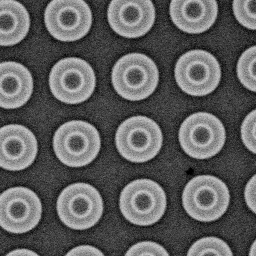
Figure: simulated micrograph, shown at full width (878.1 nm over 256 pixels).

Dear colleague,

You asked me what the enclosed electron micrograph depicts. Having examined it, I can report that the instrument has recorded an array of small figures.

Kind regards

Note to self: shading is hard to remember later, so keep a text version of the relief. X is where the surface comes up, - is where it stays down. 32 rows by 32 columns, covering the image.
XXX---XXXXX---XXXXX--XXXXXX--XXX
XXX---XXXXX--XXXXXX--XXXXXX--XXX
XXXX--XXXXX---XXXXX---XXXXX---XX
XXXX--XXXXX---XXXXX---XXXX-----X
XXX----XXX-----XX---------------
XX------------------------------
------------------------XX-----X
--------XX-----XXXX---XXXXX---XX
XXX----XXXX---XXXXXX--XXXXX---XX
XXXX--XXXXXX--XXXXXX--XXXXXX--XX
XXXX--XXXXXX--XXXXXX--XXXXX---XX
XXXX--XXXXXX---XXXX----XXX------
XXX----XXXX-----X---------------
-X------------------------------
------------------------XXX----X
--------XXX----XXXXX---XXXXX--XX
XXXX---XXXXX---XXXXX--XXXXXX--XX
XXXX---XXXXX--XXXXXX--XXXXXX--XX
XXXXX--XXXXX---XXXXX---XXXXX---X
XXXX---XXXXX---XXXX-----XXX-----
XXXX----XXX---------------------
--------------------------------
-----------------XX-----XXX----X
--X-----XXXX----XXXX---XXXXX---X
XXXXX--XXXXX---XXXXXX--XXXXXX--X
XXXXX--XXXXXX--XXXXXX--XXXXXX--X
XXXXX--XXXXXX--XXXXX---XXXXX----
XXXXX---XXXX----XXXX-----XX-----
XXXX-----XX---------------------
--------------------------------
-----------------XXX----XXXX----
-XXX-----XXXX---XXXXX---XXXXX--X